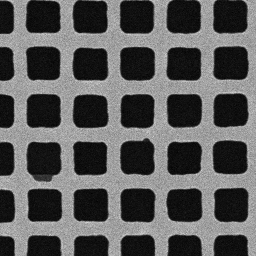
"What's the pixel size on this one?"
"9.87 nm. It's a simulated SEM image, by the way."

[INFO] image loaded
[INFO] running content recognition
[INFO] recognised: a regular array of holes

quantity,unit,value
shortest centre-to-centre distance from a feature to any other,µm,0.459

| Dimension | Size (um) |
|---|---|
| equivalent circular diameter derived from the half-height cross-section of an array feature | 0.367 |